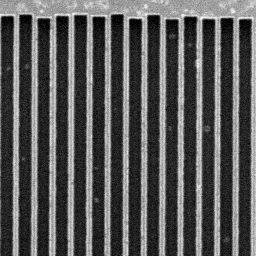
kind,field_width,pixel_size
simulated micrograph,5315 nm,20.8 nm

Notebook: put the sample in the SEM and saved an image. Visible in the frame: parallel lines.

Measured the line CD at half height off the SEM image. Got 0.096 microns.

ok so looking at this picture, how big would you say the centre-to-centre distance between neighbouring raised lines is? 380 nanometers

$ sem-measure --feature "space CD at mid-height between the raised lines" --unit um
0.291